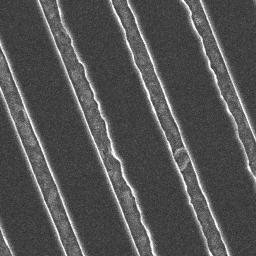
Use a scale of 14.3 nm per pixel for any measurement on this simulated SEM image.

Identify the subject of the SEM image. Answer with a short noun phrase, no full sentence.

one or a few lines or trenches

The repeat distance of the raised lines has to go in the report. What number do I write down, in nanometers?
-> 967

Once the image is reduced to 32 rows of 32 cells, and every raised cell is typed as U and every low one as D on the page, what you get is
UUUUUDDUUUUUUUDDUUUUUUUDDUUUUUUU
UUUUUDDUUUUUUUDDDUUUUUUUDDUUUUUU
UUUUUUDDUUUUUUUDDUUUUUUUDDUUUUUU
UUUUUUDDUUUUUUUDDUUUUUUUDDUUUUUU
UUUUUUUDDUUUUUUUDDUUUUUUUDDUUUUU
UUUUUUUDDUUUUUUUDDUUUUUUUDDUUUUU
UUUUUUUDDUUUUUUUDDUUUUUUUUDDUUUU
DUUUUUUUDDUUUUUUUDDUUUUUUUDDUUUU
DUUUUUUUDDDUUUUUUDDUUUUUUUDDUUUU
DDUUUUUUUDDUUUUUUUDDUUUUUUUDDUUU
DDUUUUUUUDDUUUUUUUDDUUUUUUUDDUUU
DDUUUUUUUDDDUUUUUUDDUUUUUUUUDUUU
UDDUUUUUUUDDUUUUUUUDDUUUUUUUDDUU
UDDUUUUUUUDDUUUUUUUDDUUUUUUUDDUU
UDDDUUUUUUDDDUUUUUUUDDUUUUUUUDDU
UUDDUUUUUUUDDUUUUUUUDDUUUUUUUUDU
UUDDUUUUUUUDDUUUUUUUUDUUUUUUUUDD
UUUDDUUUUUUUDDUUUUUUUDDUUUUUUUDD
UUUDDUUUUUUUDDUUUUUUUDDUUUUUUUUD
UUUDDDUUUUUUUDUUUUUUUUDDUUUUUUUD
UUUUDDUUUUUUUDDUUUUUUUDDUUUUUUUD
UUUUDDUUUUUUUDDUUUUUUUUDUUUUUUUD
UUUUUDDUUUUUUUDDUUUUUUUDDUUUUUUU
UUUUUDDUUUUUUUDDUUUUUUUDDUUUUUUU
UUUUUDDDUUUUUUUDDUUUUUUUDDUUUUUU
UUUUUUDDUUUUUUUDDUUUUUUUDDUUUUUU
UUUUUUDDUUUUUUUDDUUUUUUUDDUUUUUU
UUUUUUUDDUUUUUUUDDUUUUUUUDDUUUUU
UUUUUUUDDUUUUUUUDDUUUUUUUDDUUUUU
UUUUUUUDDDUUUUUUDDDUUUUUUUDDUUUU
DUUUUUUUDDUUUUUUUDDUUUUUUUDDUUUU
DUUUUUUUDDUUUUUUUDDUUUUUUUDDUUUU